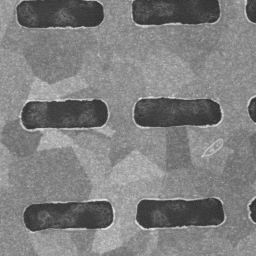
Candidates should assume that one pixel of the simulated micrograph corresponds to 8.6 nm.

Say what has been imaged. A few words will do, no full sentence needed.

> holes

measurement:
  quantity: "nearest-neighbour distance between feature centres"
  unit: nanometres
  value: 869